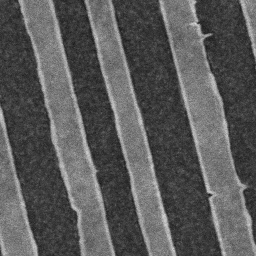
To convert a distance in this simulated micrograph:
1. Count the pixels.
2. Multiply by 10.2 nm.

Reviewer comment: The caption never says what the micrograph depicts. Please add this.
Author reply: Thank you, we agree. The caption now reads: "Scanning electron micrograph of one or a few lines or trenches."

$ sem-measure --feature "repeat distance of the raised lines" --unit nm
696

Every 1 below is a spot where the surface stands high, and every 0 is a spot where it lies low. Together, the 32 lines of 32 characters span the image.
00011100000111000000111100000011
00011110000111000000111100000001
00011110000111000000011110000001
00011110000011100000011110000001
00001110000011100000011110000001
00001111000011100000011110000000
00000111000011100000001111000000
00000111000001110000001111000000
00000111000001110000001111000000
00000111100001110000001111000000
00000111100001110000000111100000
00000011100000111000000111100000
00000011100000111000000111110000
00000011110000111000000111110000
00000011110000111000000011110000
00000011110000011100000011110000
10000001110000011100000011110000
10000001111000011100000011110000
10000001111000011100000001111000
10000001111000001110000001111000
11000000111000001110000001111000
11000000111100001110000001111000
11000000111100001110000000111100
11000000111100000111000000111100
11100000011100000111000000111100
11100000011110000111000000111110
11100000001110000111000000011110
11100000001110000011100000011110
11110000001110000011100000011110
11110000001111000011100000011110
11110000001111000011100000001111
11110000001111000001110000001111